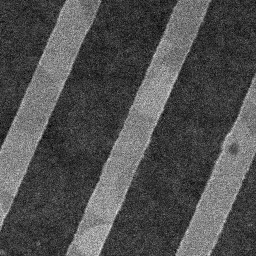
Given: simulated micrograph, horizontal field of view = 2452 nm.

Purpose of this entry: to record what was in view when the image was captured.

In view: one or a few lines or trenches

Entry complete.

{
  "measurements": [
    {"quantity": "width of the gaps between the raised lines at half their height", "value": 682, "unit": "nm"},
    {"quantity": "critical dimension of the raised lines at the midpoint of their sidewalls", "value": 288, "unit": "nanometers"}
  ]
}